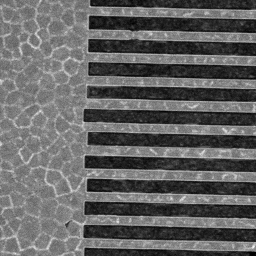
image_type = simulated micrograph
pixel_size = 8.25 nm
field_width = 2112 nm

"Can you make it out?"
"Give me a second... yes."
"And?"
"parallel lines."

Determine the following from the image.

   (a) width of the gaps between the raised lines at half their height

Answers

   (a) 0.115 micrometres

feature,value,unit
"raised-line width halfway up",73.2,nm